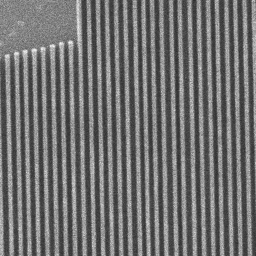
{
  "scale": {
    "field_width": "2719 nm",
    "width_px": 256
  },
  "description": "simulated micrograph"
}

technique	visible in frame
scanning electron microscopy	parallel lines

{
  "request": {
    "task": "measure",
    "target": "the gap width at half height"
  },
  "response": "53.1 nanometers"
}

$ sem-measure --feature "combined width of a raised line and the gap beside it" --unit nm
97.4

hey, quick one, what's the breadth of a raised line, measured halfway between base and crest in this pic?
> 43.8 nm